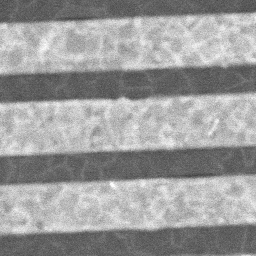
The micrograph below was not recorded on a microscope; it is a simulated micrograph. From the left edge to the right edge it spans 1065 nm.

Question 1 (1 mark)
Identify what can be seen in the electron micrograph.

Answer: one or a few lines or trenches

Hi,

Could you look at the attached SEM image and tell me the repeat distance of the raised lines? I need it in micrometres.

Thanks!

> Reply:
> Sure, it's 0.334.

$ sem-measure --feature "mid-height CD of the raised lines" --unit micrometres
0.202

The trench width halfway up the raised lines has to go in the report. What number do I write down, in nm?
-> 132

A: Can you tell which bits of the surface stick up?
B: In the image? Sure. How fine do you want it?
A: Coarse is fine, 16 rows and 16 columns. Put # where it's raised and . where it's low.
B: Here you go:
................
..##############
################
################
##..............
................
.###############
################
################
####............
................
....############
################
################
##..............
................